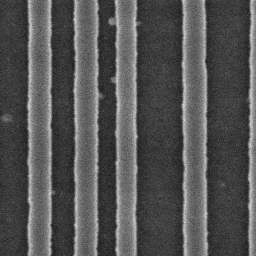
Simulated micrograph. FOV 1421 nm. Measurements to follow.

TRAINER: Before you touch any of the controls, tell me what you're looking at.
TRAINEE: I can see lines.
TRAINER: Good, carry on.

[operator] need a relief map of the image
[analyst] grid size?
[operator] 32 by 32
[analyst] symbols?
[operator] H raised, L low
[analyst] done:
LLLLHHLLLHHHLLLHHLLLLLLHHHLLLLLH
LLLLHHLLLHHHLLLHHLLLLLLHHHLLLLLH
LLLLHHLLLHHHLLLHHLLLLLLHHHLLLLLH
LLLLHHLLLHHHLLLHHLLLLLLHHHLLLLLH
LLLLHHLLLHHHLLLHHLLLLLLHHHLLLLLH
LLLLHHLLLHHHLLLHHLLLLLLHHHLLLLLH
LLLLHHLLLLHHLLLHHLLLLLLHHHLLLLLH
LLLLHHLLLHHHLLLHHLLLLLLHHHLLLLLH
LLLLHHLLLLHHLLLHHLLLLLLHHHLLLLLH
LLLLHHLLLHHHLLLHHLLLLLLHHHLLLLLH
LLLLHHLLLHHHLLLHHLLLLLLHHHLLLLLH
LLLLHHLLLHHHLLLHHLLLLLLHHHLLLLLH
LLLLHHLLLHHHLLLHHLLLLLLHHHLLLLLH
LLLLHHLLLHHHLLLHHLLLLLLHHHLLLLLH
LLLLHHLLLHHHLLLHHLLLLLLHHHLLLLLH
LLLLHHLLLHHHLLLHHLLLLLLHHHLLLLLH
LLLLHHLLLLHHLLLHHLLLLLLHHHLLLLLH
LLLLHHLLLHHHLLLHHLLLLLLHHHLLLLLH
LLLLHHLLLLHHLLLHHLLLLLLHHHLLLLLH
LLLLHHLLLLHHLLLHHLLLLLLHHHLLLLLH
LLLLHHLLLHHHLLLHHLLLLLLHHHLLLLLH
LLLLHHLLLHHHLLLHHLLLLLLHHHLLLLLH
LLLLHHLLLHHHLLLHHLLLLLLHHHLLLLLH
LLLLHHLLLLHHLLLHHLLLLLLHHHLLLLLH
LLLLHHLLLLHHLLLHHLLLLLLHHHLLLLLH
LLLLHHLLLHHHLLLHHLLLLLLHHHLLLLLH
LLLLHHLLLLHHLLLHHLLLLLLHHHLLLLLH
LLLLHHLLLLHHLLLHHLLLLLLHHHLLLLLH
LLLLHHLLLHHHLLLHHLLLLLLHHHLLLLLH
LLLLHHLLLHHHLLLHHLLLLLLHHHLLLLLH
LLLLHHLLLHHHLLLHHLLLLLLHHHLLLLLH
LLLLHHLLLHHHLLLHHLLLLLLHHHLLLLLH